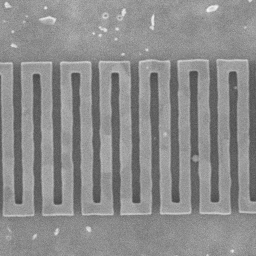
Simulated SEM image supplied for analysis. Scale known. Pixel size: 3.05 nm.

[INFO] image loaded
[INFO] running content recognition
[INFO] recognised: groups of lines, slits or small figures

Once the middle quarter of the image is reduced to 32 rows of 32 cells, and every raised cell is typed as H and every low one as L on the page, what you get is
HHHHHHHLLHHHHHHHLLLHHHHHHHLLLHHH
HHHHHHHLLHHHHHHHLLLHHHHHHHLLLHHH
HHLLHHHLLHHHLLHHHLLHHHLHHHLLLHHL
HHLLHHHLLHHHLLHHHLLHHLLLHHLLLHHL
HHLLHHHLLHHHLLHHHLLHHLLLHHLLLHHL
HHLLHHHLLHHHLLHHHLLHHLLLHHLLLHHL
HHLLHHHLLHHHLLHHHLLHHLLLHHLLLHHL
HHLLHHHLLHHHLLHHLLLHHLLLHHLLLHHL
HHLLHHHLLHHHLLHHHLLHHLLLHHLLLHHL
HHLLHHHLLHHHLLHHHLLHHLLLHHLLLHHL
HHLLHHHLLHHHLLHHHLLHHLLLHHLLLHHL
HHLLHHHLLHHHLLHHHLLHHLLLHHLLLHHL
HHLLHHHLLHHHLLHHHLLHHLLLHHLLLHHL
HHLLHHHLLHHHLLHHHLLHHLLLHHLLLHHL
HHLLHHHLLHHHLLHHHLLHHLLLHHLLLHHL
HHLLHHHLLHHHLLHHHLLHHHLLHHLLLHHL
HHLLHHHLLHHHLLHHHLLHHHLLHHLLLHHH
HHLLHHHLLHHHLLHHHLLHHHLLHHLLLHHH
HHLLHHHLLHHHLLHHHLLHHHLLHHLLLHHL
HHLLHHHLLHHHLLHHHLLHHHLLHHLLLHHL
HHLLHHHLLHHHLLHHHLLHHHLLHHLLLHHH
HHLLHHHLLHHHLLHHHLLHHHLLHHLLLHHH
HHLLHHHLLHHHLLHHHLLHHHLLHHLLLHHH
HHLLHHHLLHHHLLHHHLLHHHLLHHLLLHHL
HHLLHHHLLHHHLLHHHLLHHHLLHHLLLHHL
HHLLHHHLLHHHLLHHHLLHHHLLHHLLLHHL
HHLLHHHLLHHHLLHHHLLHHHLLHHLLLHHH
HHLLHHHLLHHHLLHHHLLHHHLLHHHLLHHH
HHLLHHHLLHHHLLHHHLLHHHLLHHHLLHHH
HHLLHHHLLHHHLLHHHLLHHHLLHHHLLHHH
HHLLHHHLLHHHLLHHHLLHHHLLHHHLLHHH
HHLLHHHLLHHHLLHHHLLHHHLLHHHLLHHH